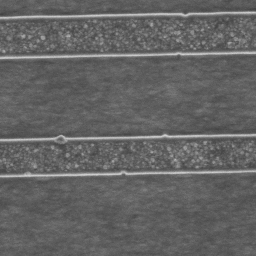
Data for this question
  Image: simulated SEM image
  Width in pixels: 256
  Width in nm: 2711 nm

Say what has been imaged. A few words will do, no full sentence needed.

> one or a few lines or trenches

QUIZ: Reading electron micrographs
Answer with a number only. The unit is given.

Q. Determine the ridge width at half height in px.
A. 39.9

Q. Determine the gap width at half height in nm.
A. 866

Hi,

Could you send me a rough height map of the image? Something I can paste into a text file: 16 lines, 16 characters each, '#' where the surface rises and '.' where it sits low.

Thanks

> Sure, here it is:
................
################
################
#####...........
................
................
................
................
...........#####
################
################
................
................
................
................
................